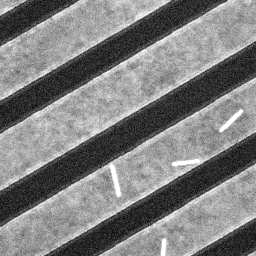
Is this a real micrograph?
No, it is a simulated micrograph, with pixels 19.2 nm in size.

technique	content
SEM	lines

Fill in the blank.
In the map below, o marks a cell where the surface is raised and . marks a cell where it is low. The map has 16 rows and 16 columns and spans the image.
o...oooooo...ooo
...ooooo....oooo
.ooooo....oooooo
ooooo...oooooo..
ooo....oooooo...
o....oooooo....o
...oooooo....ooo
..oooooo...ooooo
oooooo....ooooo.
oooo....oooooo..
oo....oooooo....
o....ooooo....oo
...oooooo...oooo
.oooooo....ooooo
ooooo....ooooo..
oooo...oooooo...